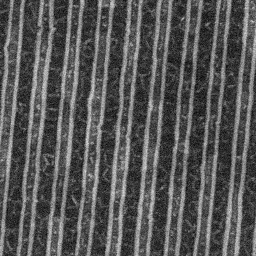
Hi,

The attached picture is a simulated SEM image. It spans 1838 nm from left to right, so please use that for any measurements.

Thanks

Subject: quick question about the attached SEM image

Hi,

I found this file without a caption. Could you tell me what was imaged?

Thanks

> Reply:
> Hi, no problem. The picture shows parallel lines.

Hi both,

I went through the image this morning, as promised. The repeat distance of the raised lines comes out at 0.211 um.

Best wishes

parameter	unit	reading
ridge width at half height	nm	80.5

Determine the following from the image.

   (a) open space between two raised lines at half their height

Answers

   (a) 128 nm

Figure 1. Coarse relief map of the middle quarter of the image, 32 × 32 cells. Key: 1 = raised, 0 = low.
11100000110000011100000110000011
11100000110000011100000110000011
11100001110000011100000110000111
11100001110000011100001110000111
11100001110000011000001110000111
11100001110000111000001110000111
11100001110000111000001110000111
11000001110000111000001100000111
11000001110000111000001100000111
11000001110000011000001100000111
11000011110000111000001100000111
11000001110000111000011100000111
11000001100000110000011100000111
11000011100000110000011100000110
11000011100000110000011100001110
11000011100000110000011100001110
11000011100000110000011100001110
10000011100000110000011100001110
11000011100000110000011100001110
10000011100001110000011000001110
10000011000001110000011000001110
10000011000001110000011000001100
10000011100001110000111000001100
10000011000001110000111000001100
10000111000001110000111000001100
10000111000001110000111000011100
10000111000001100000111000011100
10000111000001100000111000011100
00000111000001100000111000011100
00000111000001100000110000011100
00000111000011100000110000011100
00000111000011100000110000011100